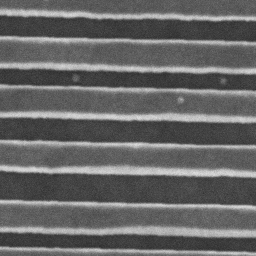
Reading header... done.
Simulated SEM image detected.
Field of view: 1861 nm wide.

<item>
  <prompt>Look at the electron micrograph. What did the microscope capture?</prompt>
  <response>lines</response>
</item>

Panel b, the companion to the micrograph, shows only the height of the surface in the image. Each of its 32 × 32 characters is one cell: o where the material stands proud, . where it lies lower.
oooooooooooooooooooooooooooooooo
oooooooooooooooooooooooooooooooo
................................
................................
................................
oooooooooooooooooooooooooooooooo
oooooooooooooooooooooooooooooooo
oooooooooooooooooooooooooooooooo
..........oooooooooooooooooooooo
................................
................................
oooooooooooooooooooooooooooooooo
oooooooooooooooooooooooooooooooo
oooooooooooooooooooooooooooooooo
oo..oooooooooooooooooooooooooooo
................................
................................
................................
oooooooooooooooooooooooooooooooo
oooooooooooooooooooooooooooooooo
oooooooooooooooooooooooooooooooo
.................o.ooooooooooooo
................................
................................
................................
ooooooooooooooo.................
oooooooooooooooooooooooooooooooo
oooooooooooooooooooooooooooooooo
oooooooooooooooooooooooooooooooo
................................
................................
ooooooooooooooooooooooooooo.....